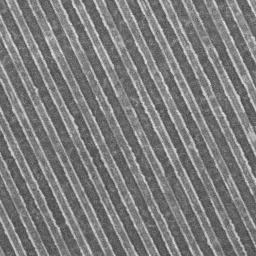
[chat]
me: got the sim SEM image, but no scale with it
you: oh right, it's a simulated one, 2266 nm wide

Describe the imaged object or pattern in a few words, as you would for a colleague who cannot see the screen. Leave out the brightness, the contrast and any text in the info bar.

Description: parallel lines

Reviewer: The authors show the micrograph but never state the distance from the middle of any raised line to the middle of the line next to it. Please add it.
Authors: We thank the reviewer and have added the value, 19.9 pixels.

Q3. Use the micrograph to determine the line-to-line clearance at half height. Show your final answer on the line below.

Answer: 88.8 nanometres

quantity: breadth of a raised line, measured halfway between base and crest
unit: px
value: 9.25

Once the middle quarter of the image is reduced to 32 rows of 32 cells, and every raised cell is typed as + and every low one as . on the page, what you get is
+...+++...++...+++...++...+++...
++...++...+++...++...+++...++...
++...+++...++...+++..+++...++...
+++...++...++....++...+++...++..
.++...+++...++...+++...++...+++.
.+++...++...++....++...+++..+++.
..++...+++..+++...++....++...+++
..+++...++...++....++...+++..+++
..+++...+++...++...++....++...++
...++....++...++...+++...++...++
....++...+++...++...+++...++...+
+...+++..+++...+++..+++...++...+
++..+++...+++...++...+++..+++...
++...+++..+++...++...+++...+++..
+++..+++...++....++...+++..+++..
+++...+++..+++...++...+++...++..
.+++..+++...++...+++...++...+++.
.+++...++...+++...++...+++...++.
..++...+++...++...+++...++...+++
..+++...++...+++...++...+++...++
...++...+++...++...+++...++...++
...+++...++...+++...++...+++...+
+...++...+++...++...+++...++...+
+...+++..+++...+++...++...+++..+
++...++...+++...++...+++...++...
++...+++..+++...+++...++...+++..
++....++...+++...++...+++...++..
+++...+++..+++...+++...++...+++.
.+++..+++...+++...++...++...+++.
.+++...+++...++...+++..+++...+++
..++....++...++....++...++....++
..+++...+++..+++...+++..+++...++